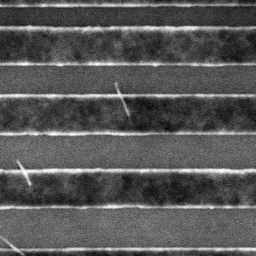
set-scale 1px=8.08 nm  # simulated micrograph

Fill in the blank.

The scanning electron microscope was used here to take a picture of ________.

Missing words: lines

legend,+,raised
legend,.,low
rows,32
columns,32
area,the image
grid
++++++++++++++++++++++++++++++++
................................
................................
++++++++++++++++++++++++++++++++
++++++++++++++++++++++++++++++++
++++++++++++++++++++++++++++++++
++++++++++++++++++++++++++++++++
++++++++++++++++++++++++++++++++
................................
................................
................................
................................
++++++++++++++++++++++++++++++++
++++++++++++++++++++++++++++++++
++++++++++++++++++++++++++++++++
++++++++++++++++++++++++++++++++
++++++++++++++++++++++++++++++++
................................
................................
................................
................................
++++++++++++++++++++++++++++++++
++++++++++++++++++++++++++++++++
++++++++++++++++++++++++++++++++
++++++++++++++++++++++++++++++++
++++++++++++++++++++++++++++++++
................................
................................
................................
................................
................................
++++++++++++++++++++++++++++++++